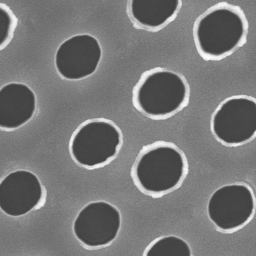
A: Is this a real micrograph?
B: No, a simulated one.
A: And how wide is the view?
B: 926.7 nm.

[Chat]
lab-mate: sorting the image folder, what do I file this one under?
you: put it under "holes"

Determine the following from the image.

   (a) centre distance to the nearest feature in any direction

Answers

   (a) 289 nm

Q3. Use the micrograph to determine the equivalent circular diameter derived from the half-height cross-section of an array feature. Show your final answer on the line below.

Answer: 159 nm